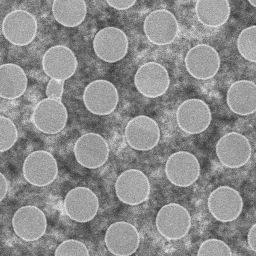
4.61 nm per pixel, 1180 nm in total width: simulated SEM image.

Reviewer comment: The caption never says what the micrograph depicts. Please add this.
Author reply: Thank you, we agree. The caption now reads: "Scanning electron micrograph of a regular array of raised bodies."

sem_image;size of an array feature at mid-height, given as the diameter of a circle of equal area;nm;158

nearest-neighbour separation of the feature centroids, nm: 247